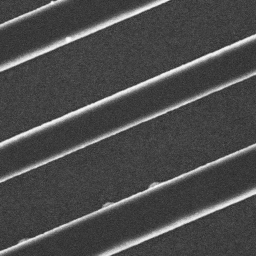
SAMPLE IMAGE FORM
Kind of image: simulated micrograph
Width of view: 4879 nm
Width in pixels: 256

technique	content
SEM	lines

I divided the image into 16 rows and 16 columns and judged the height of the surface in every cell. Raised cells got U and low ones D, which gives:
DDUUUUUUUDDDDDDD
UUUUUUUDDDDDDDDD
UUUUDDDDDDDDDDDU
UUDDDDDDDDDDDUUU
DDDDDDDDDDDUUUUU
DDDDDDDDUUUUUUDD
DDDDDDUUUUUUDDDD
DDDUUUUUUDDDDDDD
DUUUUUUDDDDDDDDD
UUUUUDDDDDDDDDDU
UUDDDDDDDDDDUUUU
DDDDDDDDDDUUUUUU
DDDDDDDDUUUUUUUD
DDDDDUUUUUUUDDDD
DDDUUUUUUUDDDDDD
DUUUUUUUDDDDDDDD